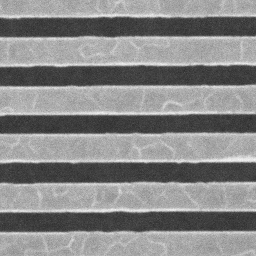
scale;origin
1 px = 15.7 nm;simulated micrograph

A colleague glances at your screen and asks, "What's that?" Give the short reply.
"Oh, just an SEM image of lines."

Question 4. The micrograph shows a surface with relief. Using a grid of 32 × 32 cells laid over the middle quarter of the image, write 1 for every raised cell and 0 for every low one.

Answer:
00000000000000000000000000000000
00000000000000000000000000000000
00000000000000000000000000000000
00000000000000000000000000000000
00000000000000000000000000000000
00000000000000000000000000000000
11111111111111111111111111111111
11111111111111111111111111111111
11111111111111111111111111111111
11111111111111111111111111111111
11111111111111111111111111111111
11111111111111111111111111111111
11111111111111111111111111010000
00000000000000000000000000000000
00000000000000000000000000000000
00000000000000000000000000000000
00000000000000000000000000000000
00000000000000000000000000000011
11111111111111111111111111111111
11111111111111111111111111111111
11111111111111111111111111111111
11111111111111111111111111111111
11111111111111111111111111111111
11111111111111111111111111111111
00100000000000000000000000001000
00000000000000000000000000000000
00000000000000000000000000000000
00000000000000000000000000000000
00000000000000000000000000000000
00000000000000000000000000000000
11111111111111111111111111111111
11111111111111111111111111111111